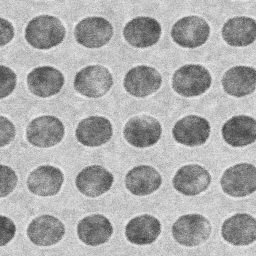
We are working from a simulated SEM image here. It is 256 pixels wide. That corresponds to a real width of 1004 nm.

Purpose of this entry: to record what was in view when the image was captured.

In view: a regular array of holes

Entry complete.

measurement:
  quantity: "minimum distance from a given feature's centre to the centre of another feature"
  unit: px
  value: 48.5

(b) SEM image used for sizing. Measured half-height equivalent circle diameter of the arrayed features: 144 nm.